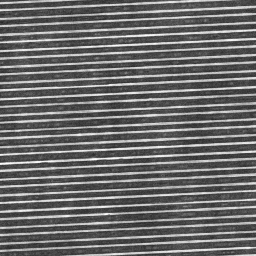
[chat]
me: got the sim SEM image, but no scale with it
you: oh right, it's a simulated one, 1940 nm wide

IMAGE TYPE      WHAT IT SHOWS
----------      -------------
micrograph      parallel lines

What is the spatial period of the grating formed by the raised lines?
60.8 nanometers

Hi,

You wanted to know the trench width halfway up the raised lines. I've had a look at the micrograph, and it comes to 0.053 microns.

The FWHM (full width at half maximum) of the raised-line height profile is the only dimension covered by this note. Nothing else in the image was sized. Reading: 0.0133 microns